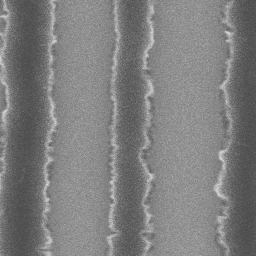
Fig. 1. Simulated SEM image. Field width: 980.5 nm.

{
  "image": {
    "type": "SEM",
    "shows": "one or a few lines or trenches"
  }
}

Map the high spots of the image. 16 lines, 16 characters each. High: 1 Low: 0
1110000111000011
1110000110000011
1110000111000011
1110000110000011
1110000110000011
1110000110000011
1110000110000011
1110000110000011
1110000110000011
1110000110000011
1110000110000011
1110000110000011
1110000110000011
1110000110000011
1110000110000011
1110000110000011